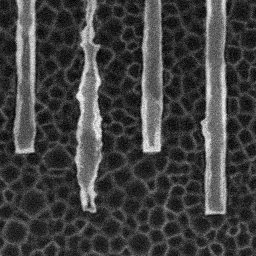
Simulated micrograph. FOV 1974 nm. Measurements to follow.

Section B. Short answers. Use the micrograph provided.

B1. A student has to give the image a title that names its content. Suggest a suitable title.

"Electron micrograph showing one or a few lines or trenches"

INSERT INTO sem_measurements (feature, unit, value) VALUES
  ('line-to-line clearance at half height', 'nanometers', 348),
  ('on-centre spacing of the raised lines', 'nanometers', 488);